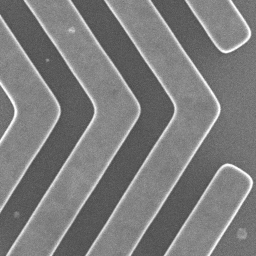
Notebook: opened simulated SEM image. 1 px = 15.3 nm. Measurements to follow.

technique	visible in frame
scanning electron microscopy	groups of lines, slits or small figures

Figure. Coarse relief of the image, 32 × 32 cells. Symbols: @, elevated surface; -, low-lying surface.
---@@@@@@----@@@@@@----@@@@@@---
----@@@@@@----@@@@@@----@@@@@@--
-----@@@@@-----@@@@@-----@@@@@--
@----@@@@@@----@@@@@@-----@@@@@-
@@----@@@@@@----@@@@@@----@@@@@-
@@-----@@@@@-----@@@@@-----@@@--
@@@----@@@@@@----@@@@@@---------
@@@@----@@@@@@----@@@@@@--------
@@@@-----@@@@@-----@@@@@--------
@@@@@----@@@@@@-----@@@@@-------
@@@@@@----@@@@@@----@@@@@@------
-@@@@@-----@@@@@-----@@@@@@-----
-@@@@@@----@@@@@@----@@@@@@-----
--@@@@@-----@@@@@-----@@@@@-----
--@@@@@-----@@@@@-----@@@@@-----
-@@@@@@----@@@@@@----@@@@@@-----
-@@@@@-----@@@@@----@@@@@@------
@@@@@@----@@@@@@----@@@@@-------
@@@@@----@@@@@@----@@@@@@-------
@@@@-----@@@@@-----@@@@@--------
@@@@----@@@@@@----@@@@@---------
@@@----@@@@@@----@@@@@@----@@@--
@@@----@@@@@-----@@@@@-----@@@@-
@@----@@@@@@----@@@@@@----@@@@@-
@----@@@@@@----@@@@@@----@@@@@@-
@----@@@@@-----@@@@@-----@@@@@--
----@@@@@@----@@@@@@----@@@@@@--
----@@@@@-----@@@@@----@@@@@@---
---@@@@@@----@@@@@-----@@@@@----
--@@@@@@----@@@@@@----@@@@@@----
--@@@@@-----@@@@@----@@@@@@-----
-@@@@@@----@@@@@@----@@@@@------